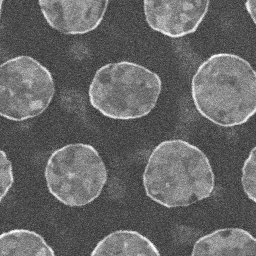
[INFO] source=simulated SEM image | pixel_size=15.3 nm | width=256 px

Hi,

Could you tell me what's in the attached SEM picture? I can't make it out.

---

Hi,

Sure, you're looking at raised bodies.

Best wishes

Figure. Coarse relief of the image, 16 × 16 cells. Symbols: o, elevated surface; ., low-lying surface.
...oooo..oooo...
...ooo...ooo....
................
................
ooo...ooo...oooo
ooo...oooo..oooo
ooo...oooo..oooo
.............oo.
................
....oo....ooo...
o..oooo..oooo..o
o..ooo...oooo..o
....oo....oo....
................
.o............o.
ooo...oooo..oooo